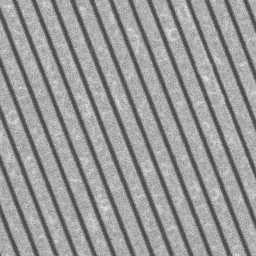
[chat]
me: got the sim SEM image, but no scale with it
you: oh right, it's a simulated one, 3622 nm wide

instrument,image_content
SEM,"parallel lines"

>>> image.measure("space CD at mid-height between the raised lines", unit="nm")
64.2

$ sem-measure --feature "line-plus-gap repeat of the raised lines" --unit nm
254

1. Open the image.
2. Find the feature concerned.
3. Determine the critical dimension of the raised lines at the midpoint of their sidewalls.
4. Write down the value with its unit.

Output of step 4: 190 nanometres